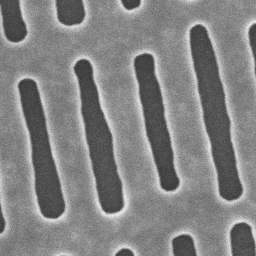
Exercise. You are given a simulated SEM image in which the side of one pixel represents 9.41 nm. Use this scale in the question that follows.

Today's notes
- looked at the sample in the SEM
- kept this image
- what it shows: holes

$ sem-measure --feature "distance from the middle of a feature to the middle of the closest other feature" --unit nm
558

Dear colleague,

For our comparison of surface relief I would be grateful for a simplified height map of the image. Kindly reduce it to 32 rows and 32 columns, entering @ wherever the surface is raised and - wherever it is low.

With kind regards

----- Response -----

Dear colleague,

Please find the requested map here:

--@@@@@---@@@@@---@@@@@@@@@@@@@@
---@@@@----@@@@@@@@@@@@@@@@@@@@@
---@@@@---@@@@@@@@@@@@@@@@@@@@@@
---@@@@@@@@@@@@@@@@@@@@@--@@@@@-
@--@@@@@@@@@@@@@@@@@@@@@--@@@@@-
@@@@@@@@@@@@@@@@@@@@@@@@---@@@@-
@@@@@@@@@@@@@@@@@@@@@@@@---@@@@-
@@@@@@@@@@-@@@@@@--@@@@@---@@@@@
@@@@@@@@@---@@@@@--@@@@@---@@@@@
@@@@@@@@@@--@@@@@--@@@@@@---@@@@
@@---@@@@@--@@@@@---@@@@@---@@@@
@@---@@@@@--@@@@@---@@@@@---@@@@
@@@--@@@@@--@@@@@@--@@@@@---@@@@
@@@--@@@@@---@@@@@---@@@@---@@@@
@@@---@@@@---@@@@@---@@@@----@@@
@@@---@@@@----@@@@---@@@@@---@@@
@@@@--@@@@@---@@@@---@@@@@---@@@
@@@@--@@@@@---@@@@---@@@@@---@@@
@@@@--@@@@@---@@@@@---@@@@---@@@
@@@@---@@@@---@@@@@---@@@@@--@@@
@@@@---@@@@----@@@@---@@@@@---@@
@@@@---@@@@@---@@@@@--@@@@@---@@
@@@@---@@@@@---@@@@@--@@@@@---@@
@@@@----@@@@---@@@@@--@@@@@---@@
@@@@@---@@@@---@@@@@@@@@@@@@--@@
@@@@@---@@@@----@@@@@@@@@@@@@@@@
@@@@@---@@@@@--@@@@@@@@@@@@@@@@@
-@@@@@@@@@@@@@@@@@@@@@@@@@@@@@@@
-@@@@@@@@@@@@@@@@@@@@@@@@@@@@--@
@@@@@@@@@@@@@@@@@@@@@@--@@@@@---
@@@@@@@@@@@@@@@@@@@@@---@@@@@---
@@@@@@@@@@@@@@@--@@@@@---@@@@---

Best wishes